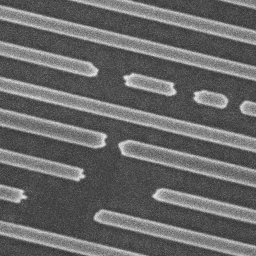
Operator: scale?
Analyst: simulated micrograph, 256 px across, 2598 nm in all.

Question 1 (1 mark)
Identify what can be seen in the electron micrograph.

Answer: parallel lines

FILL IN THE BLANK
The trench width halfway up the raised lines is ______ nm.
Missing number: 220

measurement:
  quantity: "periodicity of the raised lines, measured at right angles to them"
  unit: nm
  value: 354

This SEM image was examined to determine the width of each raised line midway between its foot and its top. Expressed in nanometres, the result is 131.